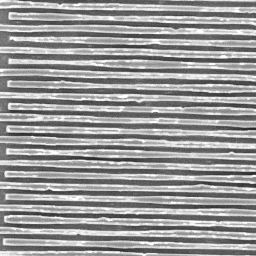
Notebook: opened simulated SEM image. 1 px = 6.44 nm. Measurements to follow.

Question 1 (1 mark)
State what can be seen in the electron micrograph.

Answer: parallel lines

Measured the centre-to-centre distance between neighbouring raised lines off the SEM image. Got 72.7 nanometres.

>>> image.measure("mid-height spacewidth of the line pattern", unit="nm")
33.8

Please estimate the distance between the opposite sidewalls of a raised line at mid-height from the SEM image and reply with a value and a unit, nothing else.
33.8 nm